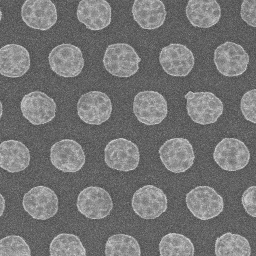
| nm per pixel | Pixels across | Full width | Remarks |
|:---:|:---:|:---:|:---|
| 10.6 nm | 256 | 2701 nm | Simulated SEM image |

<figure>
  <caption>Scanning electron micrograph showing a regular array of raised bodies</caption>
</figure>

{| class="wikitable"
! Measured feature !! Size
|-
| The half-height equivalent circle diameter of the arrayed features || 354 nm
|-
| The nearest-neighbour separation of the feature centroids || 574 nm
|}